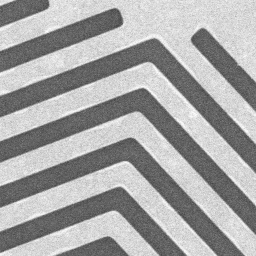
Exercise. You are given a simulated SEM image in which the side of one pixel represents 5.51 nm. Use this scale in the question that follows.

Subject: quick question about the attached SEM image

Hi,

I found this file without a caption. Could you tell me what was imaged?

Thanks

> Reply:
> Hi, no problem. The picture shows groups of lines, slits or small figures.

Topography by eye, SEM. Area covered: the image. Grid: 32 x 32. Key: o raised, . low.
......oooooooooooooooooooooooooo
.....oooooooo..ooooooooooooooooo
...ooooooo.....ooooooooooooooooo
.oooooo........oooooooooo.oooooo
ooooo.......ooooooo.oooo...ooooo
oo........ooooooo....ooo....oooo
.......ooooooo........ooo....ooo
....oooooooo..........oooo...ooo
..ooooooo........oo....oooo...oo
oooooo........oooooo....oooo...o
ooo........oooooooooo....oooo...
.........ooooooo...ooo....oooo..
......ooooooo.......ooo....oooo.
...ooooooo...........ooo....ooo.
.ooooooo........oo....ooo....ooo
ooooo........oooooo....ooo....oo
ooo.......oooooooooo...oooo....o
........ooooooo..oooo...oooo....
.....ooooooo......oooo...oooo...
..ooooooo..........oooo...oooo..
ooooooo........o....oooo...oooo.
oooo........ooooo....oooo...oooo
oo.......ooooooooo....ooo....ooo
.......ooooooo..ooo....ooo....oo
....oooooooo.....ooo....ooo....o
.oooooooo........oooo....ooo....
oooooo............oooo....ooo...
oooo.......ooooo...oooo....ooo..
o........oooooooo...oooo...oooo.
......oooooooooooo...oooo....ooo
...oooooooo....ooo....oooo....oo
.oooooo.........ooo....oooo...oo